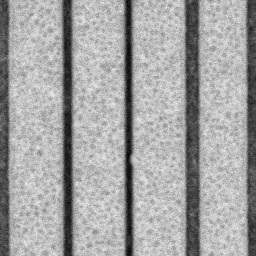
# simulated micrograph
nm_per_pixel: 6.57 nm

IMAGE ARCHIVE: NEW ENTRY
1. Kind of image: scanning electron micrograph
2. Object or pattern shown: one or a few lines or trenches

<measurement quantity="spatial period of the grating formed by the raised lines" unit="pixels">62.3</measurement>